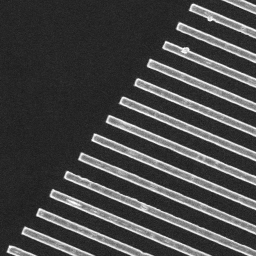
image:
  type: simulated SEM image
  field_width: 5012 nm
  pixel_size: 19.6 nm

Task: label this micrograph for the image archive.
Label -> parallel lines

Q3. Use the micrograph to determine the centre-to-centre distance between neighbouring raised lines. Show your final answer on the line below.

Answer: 439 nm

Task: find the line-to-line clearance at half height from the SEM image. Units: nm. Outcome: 293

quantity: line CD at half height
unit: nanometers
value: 147